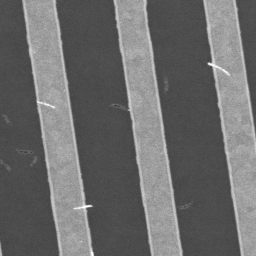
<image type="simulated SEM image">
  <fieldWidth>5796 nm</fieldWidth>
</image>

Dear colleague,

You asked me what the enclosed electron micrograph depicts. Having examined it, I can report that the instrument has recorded one or a few lines or trenches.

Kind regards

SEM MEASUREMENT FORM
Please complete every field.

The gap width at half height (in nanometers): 1370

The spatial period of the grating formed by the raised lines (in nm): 2020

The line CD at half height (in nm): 664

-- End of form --